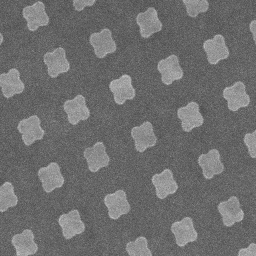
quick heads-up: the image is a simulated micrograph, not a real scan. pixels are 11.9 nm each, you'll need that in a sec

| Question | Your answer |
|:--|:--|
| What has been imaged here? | a regular array of raised bodies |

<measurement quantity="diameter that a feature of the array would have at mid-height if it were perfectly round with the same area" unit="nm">292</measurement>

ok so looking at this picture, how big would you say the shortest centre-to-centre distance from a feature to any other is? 598 nm